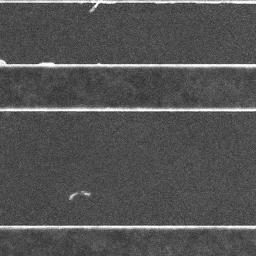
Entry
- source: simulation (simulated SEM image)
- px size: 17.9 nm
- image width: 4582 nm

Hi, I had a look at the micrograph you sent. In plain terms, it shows lines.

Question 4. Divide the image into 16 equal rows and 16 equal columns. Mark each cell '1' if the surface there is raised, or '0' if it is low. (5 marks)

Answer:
0000000000000000
0000000000000000
0000000000000000
0000000000000000
1111111111111111
1111111111111111
1111111111111111
0000000000000000
0000000000000000
0000000000000000
0000000000000000
0000000000000000
0000000000000000
0000000000000000
1111111111111111
1111111111111111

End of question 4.